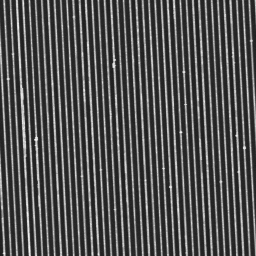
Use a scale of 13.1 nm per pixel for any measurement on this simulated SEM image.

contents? parallel lines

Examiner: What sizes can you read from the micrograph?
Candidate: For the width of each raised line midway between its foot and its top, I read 23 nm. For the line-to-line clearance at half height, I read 67.2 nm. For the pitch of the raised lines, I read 82.5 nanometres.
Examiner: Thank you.